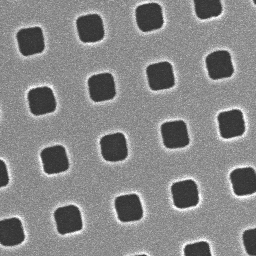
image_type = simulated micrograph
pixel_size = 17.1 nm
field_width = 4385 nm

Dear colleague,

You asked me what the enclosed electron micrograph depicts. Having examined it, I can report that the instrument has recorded a regular array of holes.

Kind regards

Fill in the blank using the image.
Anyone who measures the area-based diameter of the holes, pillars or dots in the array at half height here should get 511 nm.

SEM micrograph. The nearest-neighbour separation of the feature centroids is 1030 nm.